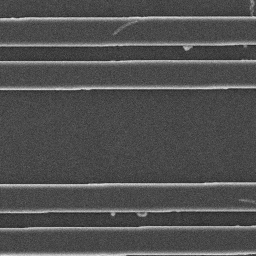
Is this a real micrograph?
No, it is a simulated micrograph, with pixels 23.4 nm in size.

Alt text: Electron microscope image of lines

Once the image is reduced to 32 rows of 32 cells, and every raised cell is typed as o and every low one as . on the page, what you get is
................................
................................
oooooooooooooooooooooooooooooooo
oooooooooooooooooooooooooooooooo
oooooooooooooooooooooooooooooooo
ooooooooooooooooooooooooooooo...
................................
................................
oooooooooooooooooooooooooooooooo
oooooooooooooooooooooooooooooooo
oooooooooooooooooooooooooooooooo
................................
................................
................................
................................
................................
................................
................................
................................
................................
................................
................................
................................
oooooooooooooooooooooooooooooooo
oooooooooooooooooooooooooooooooo
oooooooooooooooooooooooooooooooo
oooooo...........oo.............
................................
...ooooooooooooooooooooooooooooo
oooooooooooooooooooooooooooooooo
oooooooooooooooooooooooooooooooo
oooooooooooooooooooooooooooooooo